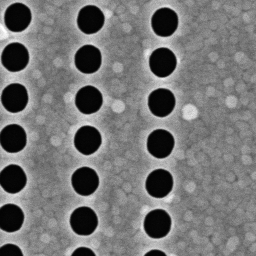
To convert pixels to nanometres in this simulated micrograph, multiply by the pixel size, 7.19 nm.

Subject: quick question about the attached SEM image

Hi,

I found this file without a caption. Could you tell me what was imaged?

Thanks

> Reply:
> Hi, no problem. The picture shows a regular array of holes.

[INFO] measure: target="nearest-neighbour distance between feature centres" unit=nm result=287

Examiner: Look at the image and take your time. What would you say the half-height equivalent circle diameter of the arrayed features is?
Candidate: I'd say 203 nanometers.